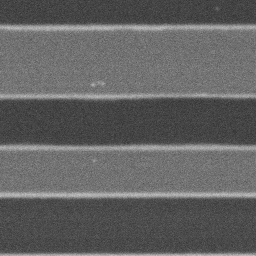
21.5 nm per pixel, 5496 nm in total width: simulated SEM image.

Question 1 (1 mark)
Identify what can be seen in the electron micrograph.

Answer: lines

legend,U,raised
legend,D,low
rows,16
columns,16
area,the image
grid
DDDDDDDDDDDDDDDD
DDDDDDDDDDDDDDDD
UUUUUUUUUUUUUUUU
UUUUUUUUUUUUUUUU
UUUUUUUUUUUUUUUU
UUUUUUUUUUUUUUUU
DDDDDDDDDDDDDDDD
DDDDDDDDDDDDDDDD
DDDDDDDDDDDDDDDD
UUUUUUUUUUUUUUUU
UUUUUUUUUUUUUUUU
UUUUUUUUUUUUUUUU
DDDDDDDDDDDDDDDD
DDDDDDDDDDDDDDDD
DDDDDDDDDDDDDDDD
DDDDDDDDDDDDDDDD